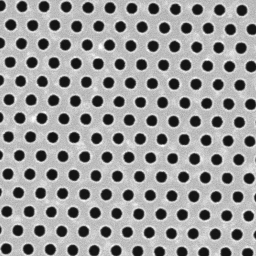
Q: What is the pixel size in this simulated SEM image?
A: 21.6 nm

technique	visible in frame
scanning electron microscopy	a regular array of holes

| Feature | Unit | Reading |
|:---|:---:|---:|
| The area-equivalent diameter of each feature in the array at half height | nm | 248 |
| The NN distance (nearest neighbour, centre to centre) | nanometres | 459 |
